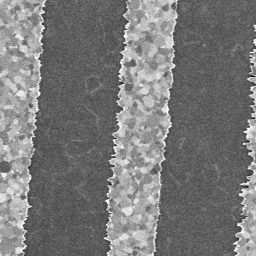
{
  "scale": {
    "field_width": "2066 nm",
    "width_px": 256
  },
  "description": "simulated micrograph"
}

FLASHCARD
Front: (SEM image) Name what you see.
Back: one or a few lines or trenches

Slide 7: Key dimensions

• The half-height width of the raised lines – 0.395 um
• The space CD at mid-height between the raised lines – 668 nm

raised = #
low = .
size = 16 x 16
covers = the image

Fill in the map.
###.....###.....
###.....###.....
###.....###.....
###.....###.....
###.....###.....
##......###.....
##......##......
##.....####.....
##.....###.....#
##.....###......
##.....###......
##.....###.....#
##.....###.....#
##.....###.....#
##.....###.....#
#......###.....#